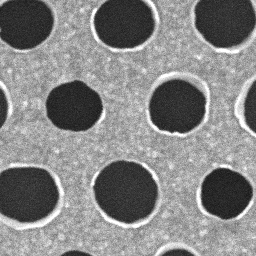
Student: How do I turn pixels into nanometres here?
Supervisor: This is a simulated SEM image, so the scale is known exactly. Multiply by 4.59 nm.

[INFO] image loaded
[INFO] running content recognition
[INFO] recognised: holes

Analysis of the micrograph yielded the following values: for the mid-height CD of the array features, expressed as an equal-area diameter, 255 nm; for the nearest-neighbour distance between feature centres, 456 nm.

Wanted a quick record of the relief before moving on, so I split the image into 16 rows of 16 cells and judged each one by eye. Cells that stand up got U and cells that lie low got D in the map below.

DDDUUUDDDUUUDDDD
DDDUUUDDDDUUDDDD
DDDUUUDDDUUUUDDU
UUUUUUUUUUUUUUUU
UUUUUUUUUUUUUUUU
UUUDDDUUUUDDUUUU
UUUDDDUUUDDDDUUD
UUUDDDUUUDDDDUUD
UUUUUUUUUUUUUUUU
UUUUUUUUUUUUUUUU
UDDUUUDDDUUUUUUU
DDDUUUDDDDUUUDDD
DDDDUUDDDDUUUDDD
DDDUUUUDDUUUUDDU
UUUUUUUUUUUUUUUU
UUUUUUUUUUUUUUUU